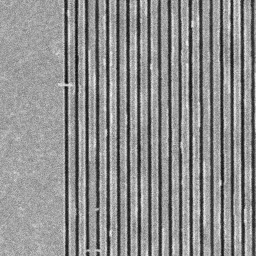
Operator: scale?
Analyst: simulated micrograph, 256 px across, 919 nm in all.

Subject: parallel lines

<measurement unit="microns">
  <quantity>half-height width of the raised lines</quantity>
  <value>0.022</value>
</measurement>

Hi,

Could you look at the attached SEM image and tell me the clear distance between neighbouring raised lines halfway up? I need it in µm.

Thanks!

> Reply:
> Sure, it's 0.0157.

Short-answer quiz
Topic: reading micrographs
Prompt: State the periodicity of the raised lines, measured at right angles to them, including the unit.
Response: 37.2 nanometers